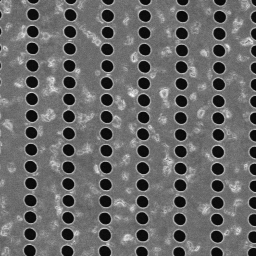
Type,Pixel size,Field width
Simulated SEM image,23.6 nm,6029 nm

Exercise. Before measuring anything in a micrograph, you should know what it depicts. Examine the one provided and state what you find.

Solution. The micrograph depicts a regular array of holes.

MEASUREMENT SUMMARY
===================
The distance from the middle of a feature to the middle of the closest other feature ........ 393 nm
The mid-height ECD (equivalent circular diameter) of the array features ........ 280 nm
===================